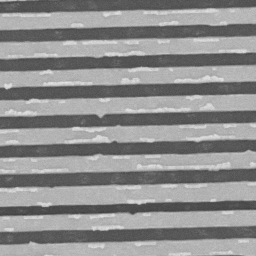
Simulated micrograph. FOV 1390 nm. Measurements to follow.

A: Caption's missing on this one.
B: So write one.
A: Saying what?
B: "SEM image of parallel lines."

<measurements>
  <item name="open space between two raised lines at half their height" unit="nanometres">73.3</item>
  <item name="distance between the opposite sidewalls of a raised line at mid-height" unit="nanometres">84.1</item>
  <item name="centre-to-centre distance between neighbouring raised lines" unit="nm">157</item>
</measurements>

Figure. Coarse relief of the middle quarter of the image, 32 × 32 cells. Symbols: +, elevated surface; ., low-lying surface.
................................
......++++++++++++++++++++++++++
++++++++++++++++++++++++++++++++
++++++++++++++++++++++++++++++++
++++++++++++++++++++++++++++++++
................................
................................
................................
................++++++++++++++++
++++++++++++++++++++++++++++++++
++++++++++++++++++++++++++++++++
++++++++++++++++++++++++++++++++
+.......++......................
................................
................................
..........................++++++
++++++++++++++++++++++++++++++++
++++++++++++++++++++++++++++++++
++++++++++++++++++++++++++++++++
++++++++++++........+...........
................................
................................
................................
++++++++++++++++++++++++++++++++
++++++++++++++++++++++++++++++++
++++++++++++++++++++++++++++++++
++++++++++++++++++++++..........
................................
................................
................................
................++++++++++++++++
++++++++++++++++++++++++++++++++